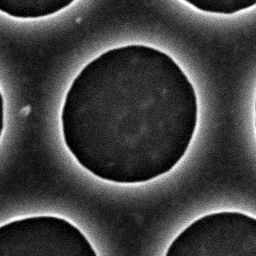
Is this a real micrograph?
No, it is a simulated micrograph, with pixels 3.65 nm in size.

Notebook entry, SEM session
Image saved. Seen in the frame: holes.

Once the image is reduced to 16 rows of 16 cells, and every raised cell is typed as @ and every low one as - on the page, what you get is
----@@@@@@@@----
@@@@@@@@@@@@@@@@
@@@@@@@@@@@@@@@@
@@@@@@-----@@@@@
@@@@@------@@@@@
@@@@--------@@@@
@@@@--------@@@@
@@@@--------@@@@
@@@@--------@@@@
@@@@--------@@@@
@@@@@------@@@@@
@@@@@@@@@@@@@@@@
@@@@@@@@@@@@@@@@
@@-@@@@@@@@@@---
-----@@@@@@-----
------@@@@@-----